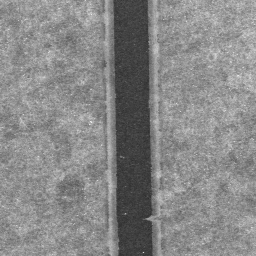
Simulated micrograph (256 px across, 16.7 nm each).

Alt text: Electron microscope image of one or a few lines or trenches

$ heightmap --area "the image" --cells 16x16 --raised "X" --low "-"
XXXXXXX---XXXXXX
XXXXXXX---XXXXXX
XXXXXXX---XXXXXX
XXXXXXX---XXXXXX
XXXXXXX---XXXXXX
XXXXXXX---XXXXXX
XXXXXXX---XXXXXX
XXXXXXX---XXXXXX
XXXXXXX---XXXXXX
XXXXXXX---XXXXXX
XXXXXXX---XXXXXX
XXXXXXX---XXXXXX
XXXXXXX---XXXXXX
XXXXXXX---XXXXXX
XXXXXXX---XXXXXX
XXXXXXX---XXXXXX